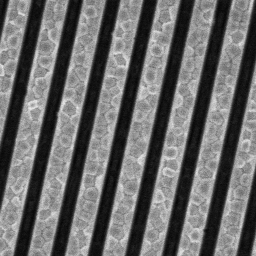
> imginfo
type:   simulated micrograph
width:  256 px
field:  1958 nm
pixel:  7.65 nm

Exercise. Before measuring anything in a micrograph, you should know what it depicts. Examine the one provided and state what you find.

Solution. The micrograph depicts parallel lines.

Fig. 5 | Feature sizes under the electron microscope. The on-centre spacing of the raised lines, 278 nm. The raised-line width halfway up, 0.181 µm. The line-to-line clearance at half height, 12.2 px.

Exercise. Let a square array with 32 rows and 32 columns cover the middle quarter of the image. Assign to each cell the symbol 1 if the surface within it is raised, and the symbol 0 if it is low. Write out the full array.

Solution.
01111110001111110001111111000111
01111110001111110001111110000111
01111110001111110001111110001111
11111100001111110001111110001111
11111100011111100001111110001111
11111100011111100011111110001111
11111100011111100011111100001111
11111100011111100011111100011111
11111000011111100011111100011111
11111000111111000011111100011111
11111000111111000111111100011111
11111000111111000111111000011111
11110000111111000111111000111111
11110001111110000111111000111111
11110001111110001111111000111111
11110001111110001111110000111111
11110001111110001111110001111110
11100001111110001111110001111110
11100011111110001111110001111110
11100011111100011111110001111110
11100011111100011111100001111110
11100011111100011111100011111100
11000011111100011111100011111100
11000111111100111111100011111100
11000111111000111111000011111100
11000111111000111111000111111000
10000111111000111111000111111000
10001111111000111111000111111000
10001111110001111111000111111000
10001111110001111110000111111000
10001111110001111110001111110000
00001111110001111110001111110000